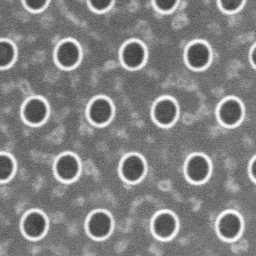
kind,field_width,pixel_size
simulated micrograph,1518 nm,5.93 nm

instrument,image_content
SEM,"a regular array of raised bodies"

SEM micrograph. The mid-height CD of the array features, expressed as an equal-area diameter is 0.165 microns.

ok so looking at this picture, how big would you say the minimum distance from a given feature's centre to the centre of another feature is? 65 px